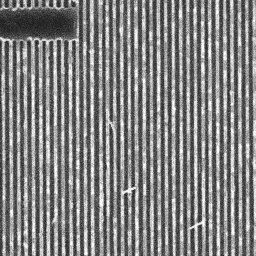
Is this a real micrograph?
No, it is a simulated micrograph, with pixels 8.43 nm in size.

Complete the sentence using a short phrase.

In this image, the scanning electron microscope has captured parallel lines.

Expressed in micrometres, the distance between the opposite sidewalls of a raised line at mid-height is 0.0242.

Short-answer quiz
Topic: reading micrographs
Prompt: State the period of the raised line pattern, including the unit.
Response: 7.38 px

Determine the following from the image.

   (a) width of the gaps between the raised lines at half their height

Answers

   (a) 41.1 nanometres